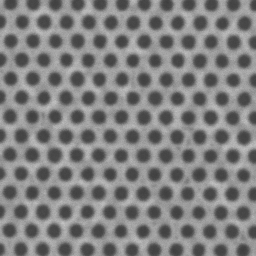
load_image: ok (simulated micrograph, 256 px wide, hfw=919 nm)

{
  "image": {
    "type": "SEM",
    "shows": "a regular array of holes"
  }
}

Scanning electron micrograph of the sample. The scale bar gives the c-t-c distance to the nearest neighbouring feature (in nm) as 77.8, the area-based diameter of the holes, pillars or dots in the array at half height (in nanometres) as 48.9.